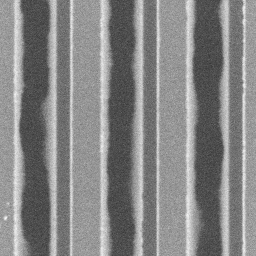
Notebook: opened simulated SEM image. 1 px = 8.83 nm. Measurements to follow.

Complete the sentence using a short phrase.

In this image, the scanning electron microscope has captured lines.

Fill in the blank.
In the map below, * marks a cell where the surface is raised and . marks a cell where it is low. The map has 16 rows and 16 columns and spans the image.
*..***...***..**
*..***...***..**
*..***...***..**
*..***...***..**
*..***...***..**
*..***...***..**
*..***...***..**
*..***...***..**
*..***...***..**
*..***...***..**
*..***...***..**
*..***...***..**
*..***...***..**
*..***...***..**
*..***...***..**
*..***...***..**